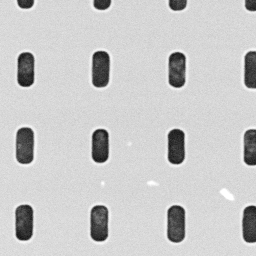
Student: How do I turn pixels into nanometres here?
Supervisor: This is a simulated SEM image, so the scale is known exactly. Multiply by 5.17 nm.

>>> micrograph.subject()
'a regular array of holes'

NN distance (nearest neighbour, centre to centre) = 391 nm